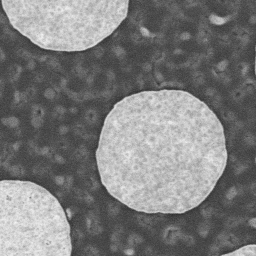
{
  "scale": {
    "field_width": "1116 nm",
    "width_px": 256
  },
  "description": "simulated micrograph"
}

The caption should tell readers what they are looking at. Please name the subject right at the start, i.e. raised bodies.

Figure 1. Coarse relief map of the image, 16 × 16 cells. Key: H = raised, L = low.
HHHHHHHHLLLLLLLL
LHHHHHHLLLLLLLLL
LLHHHHLLLLLLLLLL
LLLLLLLLLLLLLLLL
LLLLLLLLLLLLLLLL
LLLLLLLLLLLLLLLL
LLLLLLLHHHHHHLLL
LLLLLLLHHHHHHHLL
LLLLLLHHHHHHHHLL
LLLLLLHHHHHHHHLL
LLLLLLHHHHHHHHLL
HLLLLLLHHHHHHLLL
HHHLLLLHHHHHHLLL
HHHHLLLLLLLLLLLL
HHHHLLLLLLLLLLLL
HHHHLLLLLLLLLLLH